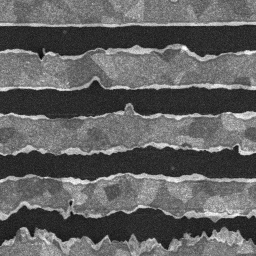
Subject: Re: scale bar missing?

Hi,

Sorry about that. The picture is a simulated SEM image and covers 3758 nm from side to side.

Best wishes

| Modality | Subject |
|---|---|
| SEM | one or a few lines or trenches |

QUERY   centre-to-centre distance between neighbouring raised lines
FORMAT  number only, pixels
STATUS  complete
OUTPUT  63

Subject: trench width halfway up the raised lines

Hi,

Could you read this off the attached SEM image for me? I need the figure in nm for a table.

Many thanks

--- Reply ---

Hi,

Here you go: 402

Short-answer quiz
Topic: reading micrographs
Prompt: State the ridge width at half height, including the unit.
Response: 0.506 micrometres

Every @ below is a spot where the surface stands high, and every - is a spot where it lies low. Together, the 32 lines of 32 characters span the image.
@@@@@@@@@@@@@@@@@@@@@@@@@@@@@@@@
@@@@@@@@@@@@@@@@@@@@@@@@@@@@@@@@
@@@@@@@@@@@@@@@@@@@@@@@@@@@@@@@@
--------------------------------
--------------------------------
--------------------------------
@@@@-------@@@-@@@@@@@@@-------@
@@@@@@@@@@@@@@@@@@@@@@@@@@@@@@@@
@@@@@@@@@@@@@@@@@@@@@@@@@@@@@@@@
@@@@@@@@@@@@@@@@@@@@@@@@@@@@@@@@
@@@@@@@@@@@--@@@@@@@@@@@@@@@@@@@
--------------------------------
--------------------------------
--------------------------------
@@@----------@@@@@-@@--@@@-@@@@@
@@@@@@@@@@@@@@@@@@@@@@@@@@@@@@@@
@@@@@@@@@@@@@@@@@@@@@@@@@@@@@@@@
@@@@@@@@@@@@@@@@@@@@@@@@@@@@@@@@
@@@@@@@@@@@@@@@@@-----@@@@@@@-@@
--------------------------------
--------------------------------
--------------------------------
-@@@@@@-----@@@@@@@@@--@@@----@-
@@@@@@@@@@@@@@@@@@@@@@@@@@@@@@@@
@@@@@@@@@@@@@@@@@@@@@@@@@@@@@@@@
@@@@@@@@@@@@@@@@@@@@@@@@@@@@@@@@
@@------@@@@@@--@----@@@@@@@@@@@
--------------------------------
--------------------------------
--@@@@@------------------@------
@@@@@@@@@@@-@@@@---@--@@@@@@@@@@
@@@@@@@@@@@@@@@@@@@@@@@@@@@@@@@@